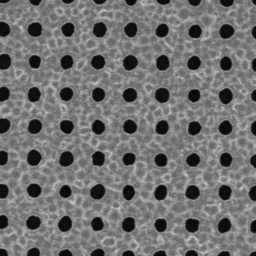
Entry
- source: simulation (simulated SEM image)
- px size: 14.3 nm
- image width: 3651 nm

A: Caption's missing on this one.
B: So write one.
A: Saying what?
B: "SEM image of a regular array of holes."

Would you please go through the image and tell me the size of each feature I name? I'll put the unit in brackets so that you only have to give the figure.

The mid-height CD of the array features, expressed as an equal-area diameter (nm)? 208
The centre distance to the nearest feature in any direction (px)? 31.5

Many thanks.